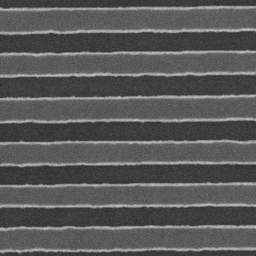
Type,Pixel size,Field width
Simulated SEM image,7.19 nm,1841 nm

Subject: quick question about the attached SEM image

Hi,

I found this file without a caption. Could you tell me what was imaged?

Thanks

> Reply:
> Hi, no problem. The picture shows lines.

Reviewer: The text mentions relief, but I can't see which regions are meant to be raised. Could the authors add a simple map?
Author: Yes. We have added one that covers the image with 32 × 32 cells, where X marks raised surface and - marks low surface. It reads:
--------------------------------
XXXXXXXXXXXXXXXXXXXXXXXXXXXXXXXX
XXXXXXXXXXXXXXXXXXXXXXXXXXXXXXXX
XXXXXXXXXXXXXXXXXXXXXXXXXXXXXXXX
--------------------------------
--------------------------------
-------------------------XXXXXXX
XXXXXXXXXXXXXXXXXXXXXXXXXXXXXXXX
XXXXXXXXXXXXXXXXXXXXXXXXXXXXXXXX
XXXXXXXX------------------------
--------------------------------
--------------------------------
XXXXXXXXXXXXXXXXXXXXXXXXXXXXXXXX
XXXXXXXXXXXXXXXXXXXXXXXXXXXXXXXX
XXXXXXXXXXXXXXXXXXXXXXXXXXXXXXXX
--------------------------------
--------------------------------
--------------------------------
XXXXXXXXXXXXXXXXXXXXXXXXXXXXXXXX
XXXXXXXXXXXXXXXXXXXXXXXXXXXXXXXX
XXXXXXXXXXXXX-------------------
--------------------------------
--------------------------------
XXXXXXXXXXXXXXXXXXXXXXXXXXXXXXXX
XXXXXXXXXXXXXXXXXXXXXXXXXXXXXXXX
XXXXXXXXXXXXXXXXXXXXXXXXXXXXXXXX
--------------------------------
--------------------------------
-XXXXXXXXXXXXXXXXXXXXXXXXXXXXXXX
XXXXXXXXXXXXXXXXXXXXXXXXXXXXXXXX
XXXXXXXXXXXXXXXXXXXXXXXXXXXXXXXX
--------------------------------